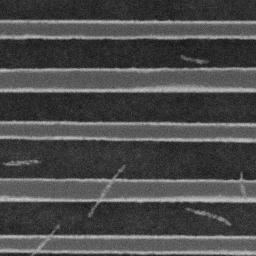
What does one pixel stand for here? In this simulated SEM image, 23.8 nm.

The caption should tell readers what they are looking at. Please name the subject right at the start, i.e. lines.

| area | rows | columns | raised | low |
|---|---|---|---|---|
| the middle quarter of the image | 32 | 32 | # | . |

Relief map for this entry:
................................
################################
################################
################################
################################
################################
################################
................................
................................
................................
................................
................................
................................
................................
................................
################################
################################
################################
################################
................................
................................
................................
................................
................................
................................
................................
................................
................................
................................
################################
################################
################################